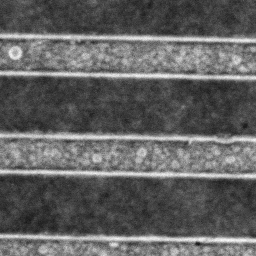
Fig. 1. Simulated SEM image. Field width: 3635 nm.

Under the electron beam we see one or a few lines or trenches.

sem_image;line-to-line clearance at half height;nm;525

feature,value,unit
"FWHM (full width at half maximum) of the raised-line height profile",63.3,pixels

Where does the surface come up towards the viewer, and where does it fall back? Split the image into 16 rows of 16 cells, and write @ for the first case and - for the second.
@@@@@@@@@@@@@@@@
@@@@@@@@@@@@@@@@
---------------@
----------------
----------------
@@@@@@@@@@@@@@@@
@@@@@@@@@@@@@@@@
@@@@@@@@@@@@@@@@
-@@@@@@@@@@@@@@@
----------------
----------------
@@@@@@@@@@@@@@@@
@@@@@@@@@@@@@@@@
@@@@@@@@@@@@@@@@
@@@@@@@@@@@@@@@@
----------------